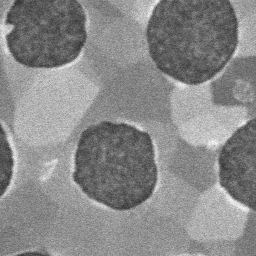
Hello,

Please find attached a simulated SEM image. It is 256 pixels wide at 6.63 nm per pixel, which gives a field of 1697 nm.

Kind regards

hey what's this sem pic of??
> holes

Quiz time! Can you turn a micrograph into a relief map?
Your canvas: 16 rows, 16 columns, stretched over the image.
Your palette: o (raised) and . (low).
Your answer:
o....ooooo.....o
o....oooo......o
.....oooo......o
o....oooo......o
oooooooooo....oo
oooooooooooooooo
oooooooooooooooo
oooooooooooooooo
ooooo....ooooo..
.oooo.....oooo..
.oooo.....oooo..
.oooo.....oooo..
oooooo...oooooo.
oooooooooooooooo
oooooooooooooooo
oooooooooooooooo